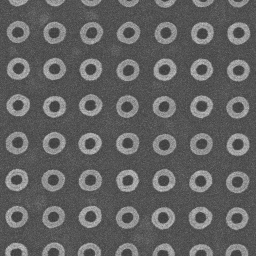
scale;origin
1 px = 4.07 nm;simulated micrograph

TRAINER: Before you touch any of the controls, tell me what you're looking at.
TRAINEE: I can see a regular array of ring-shaped raised bodies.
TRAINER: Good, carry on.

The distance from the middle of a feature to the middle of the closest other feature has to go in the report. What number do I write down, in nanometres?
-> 147